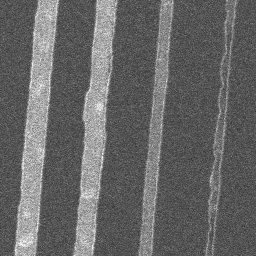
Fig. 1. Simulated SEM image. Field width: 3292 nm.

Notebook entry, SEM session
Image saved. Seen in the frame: one or a few lines or trenches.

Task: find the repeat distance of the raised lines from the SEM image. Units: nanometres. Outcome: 790